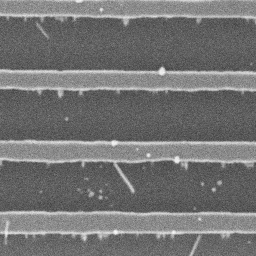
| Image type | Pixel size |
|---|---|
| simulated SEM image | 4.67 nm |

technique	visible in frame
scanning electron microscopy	lines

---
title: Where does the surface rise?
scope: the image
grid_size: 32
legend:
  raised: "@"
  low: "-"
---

@@@@@@@@@@@@@@@@@@@@@@@@@@@@@@@@
@@@@@@@@@@@@@@@@@@@@@@@@@@@@@@@@
--------------------------------
--------------------------------
--------------------------------
--------------------------------
--------------------------------
--------------------------------
--------------------------------
@@@@@@@@@@@@@@@@@@@@@@@@@@@@@@@@
@@@@@@@@@@@@@@@@@@@@@@@@@@@@@@@@
--------------------------------
--------------------------------
--------------------------------
--------------------------------
--------------------------------
--------------------------------
--------------------------------
@@@@@@@@@@@@@@@@@@@@@@@@@@@@@@@@
@@@@@@@@@@@@@@@@@@@@@@@@@@@@@@@@
--------------------------------
--------------------------------
--------------------------------
--------------------------------
--------------------------------
--------------------------------
@@@@@@-@---@@@@-----------------
@@@@@@@@@@@@@@@@@@@@@@@@@@@@@@@@
@@@@@@@@@@@@@@@@@@@@@@@@@@@@@@@@
--------------------------------
--------------------------------
--------------------------------